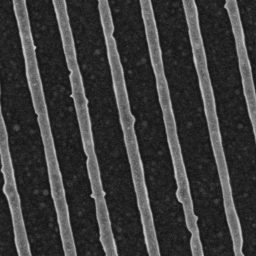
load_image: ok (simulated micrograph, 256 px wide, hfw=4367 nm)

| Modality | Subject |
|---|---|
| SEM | parallel lines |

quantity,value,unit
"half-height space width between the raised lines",535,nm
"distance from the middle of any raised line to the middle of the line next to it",713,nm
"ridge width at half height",178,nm